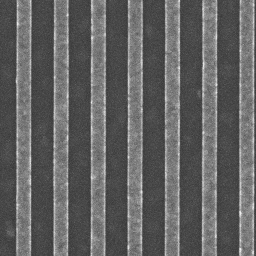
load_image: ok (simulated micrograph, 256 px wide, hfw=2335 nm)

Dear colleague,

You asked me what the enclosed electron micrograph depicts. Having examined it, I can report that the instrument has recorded parallel lines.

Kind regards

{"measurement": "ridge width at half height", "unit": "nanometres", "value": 131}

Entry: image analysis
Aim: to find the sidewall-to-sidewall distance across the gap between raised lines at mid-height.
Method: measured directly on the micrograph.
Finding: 209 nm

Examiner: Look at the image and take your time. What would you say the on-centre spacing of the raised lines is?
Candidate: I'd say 339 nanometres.